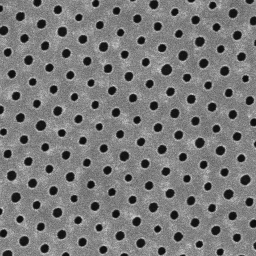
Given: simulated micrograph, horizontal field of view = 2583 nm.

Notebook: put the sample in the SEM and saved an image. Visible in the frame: a regular array of holes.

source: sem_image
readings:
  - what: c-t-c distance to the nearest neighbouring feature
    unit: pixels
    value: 21.7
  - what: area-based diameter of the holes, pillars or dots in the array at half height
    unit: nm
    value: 89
